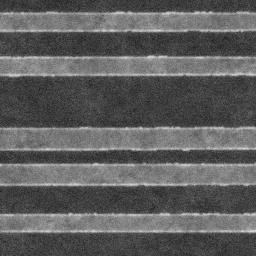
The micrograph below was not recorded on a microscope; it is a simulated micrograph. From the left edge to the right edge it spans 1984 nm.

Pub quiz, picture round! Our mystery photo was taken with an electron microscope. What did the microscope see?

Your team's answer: lines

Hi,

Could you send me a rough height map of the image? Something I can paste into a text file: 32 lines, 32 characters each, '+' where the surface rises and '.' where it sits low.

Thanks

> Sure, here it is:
................................
................................
++++++++++++++++++++++++++++++++
++++++++++++++++++++++++++++++++
................................
................................
................................
++++++++++++++++++++++++++++++++
++++++++++++++++++++++++++++++++
................................
................................
................................
................................
................................
................................
................................
++++++++++++++++++++++++++++++++
++++++++++++++++++++++++++++++++
++++++++++++++++++++++++++++++++
................................
...........++.......+++.........
++++++++++++++++++++++++++++++++
++++++++++++++++++++++++++++++++
................................
................................
................................
................................
++++++++++++++++++++++++++++++++
++++++++++++++++++++++++++++++++
................................
................................
................................